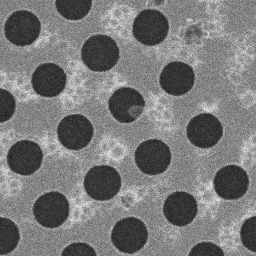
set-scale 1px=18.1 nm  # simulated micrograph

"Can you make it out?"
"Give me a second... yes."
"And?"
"a regular array of holes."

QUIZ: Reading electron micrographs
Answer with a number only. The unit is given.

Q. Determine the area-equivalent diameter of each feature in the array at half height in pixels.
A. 37.4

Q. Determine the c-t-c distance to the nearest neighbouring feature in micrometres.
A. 1.04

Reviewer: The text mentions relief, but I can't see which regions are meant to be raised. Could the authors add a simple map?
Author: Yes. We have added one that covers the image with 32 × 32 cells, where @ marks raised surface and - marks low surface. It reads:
@@@@@@@-----@@@@@@@@@@@@@@@@@@@@
@@--@@@----@@@@@@@--@@@@@@@@@@@@
@----@@@@-@@@@@@@----@@@@@@@@@@@
-----@@@@@@@@@@@-----@@@@@@@@@@@
@----@@@@@@---@@@----@@@@@@@@@@@
@---@@@@@@-----@@@--@@@@@@@@@@@@
@@@@@@@@@@-----@@@@@@@@@@@@@@@@@
@@@@@@@@@@-----@@@@@@@@@@@@@@@@@
@@@@----@@@---@@@@@@----@@@@@@@@
@@@@----@@@@@@@@@@@@----@@@@@@@@
@@@@----@@@@@@@@@@@@----@@@@@@@@
-@@@----@@@@@@---@@@@---@@@@@@@@
--@@@@@@@@@@@@----@@@@@@@@@@@@@@
--@@@@@@@@@@@@----@@@@@@@@@@@@@@
--@@@@@@---@@@----@@@@@@---@@@@@
@@@@@@@-----@@@@@@@@@@@-----@@@@
@@@@@@@-----@@@@@@@@@@@-----@@@@
@@@-@@@----@@@@@@@--@@@@---@@@@@
@----@@@--@@@@@@@----@@@@-@@@@@@
@----@@@@@@@@@@@@----@@@@@@@@@@@
@----@@@@@@@@@@@@----@@@@@@@@@@@
@@--@@@@@@@----@@@--@@@@@@@----@
@@@@@@@@@@-----@@@@@@@@@@@@----@
@@@@@@@@@@-----@@@@@@@@@@@@----@
@@@@@---@@@---@@@@@@@---@@@---@@
@@@@-----@@@@@@@@@@@-----@@@@@@@
@@@@-----@@@@@@@@@@@-----@@@@@@@
-@@@----@@@@@@@---@@@---@@@@@@@-
--@@@@-@@@@@@@----@@@@@@@@@@@@--
---@@@@@@@@@@@-----@@@@@@@@@@@--
--@@@@@@@--@@@----@@@@@@---@@@--
-@@@@@@@----@@@--@@@@@@@----@@@@